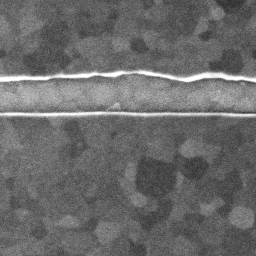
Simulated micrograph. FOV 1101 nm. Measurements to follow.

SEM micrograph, one or a few lines or trenches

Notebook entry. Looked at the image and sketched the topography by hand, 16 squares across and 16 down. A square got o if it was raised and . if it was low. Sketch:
oooooooooooooooo
oooooooooooooooo
oooooooooooooooo
oooooooooooooooo
oooooooooooooooo
................
................
oooooooooooooooo
oooooooooooooooo
oooooooooooooooo
oooooooooooooooo
oooooooooooooooo
oooooooooooooooo
oooooooooooooooo
oooooooooooooooo
oooooooooooooooo